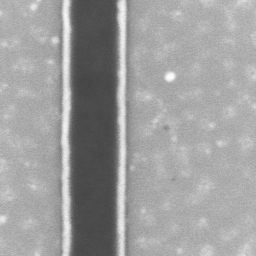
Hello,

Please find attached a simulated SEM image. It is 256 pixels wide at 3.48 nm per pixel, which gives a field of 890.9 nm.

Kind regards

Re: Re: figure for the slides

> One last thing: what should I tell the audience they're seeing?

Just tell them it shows one or a few lines or trenches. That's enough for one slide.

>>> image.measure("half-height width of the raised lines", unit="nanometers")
204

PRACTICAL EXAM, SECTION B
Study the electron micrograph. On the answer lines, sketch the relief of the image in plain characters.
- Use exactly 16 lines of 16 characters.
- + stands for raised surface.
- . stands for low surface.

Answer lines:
....++++........
....++++........
....++++........
....++++........
....++++........
....++++........
....++++........
....++++........
....++++........
....++++........
....++++........
....++++........
....++++........
....++++........
....++++........
....++++........